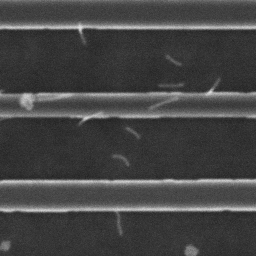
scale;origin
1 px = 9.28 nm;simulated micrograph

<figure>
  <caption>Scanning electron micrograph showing lines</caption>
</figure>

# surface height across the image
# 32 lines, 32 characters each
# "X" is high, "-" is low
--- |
XXXXXXXXXXXXXXXXXXXXXXXXXXXXXXXX
XXXXXXXXXXXXXXXXXXXXXXXXXXXXXXXX
XXXXXXXXXXXXXXXXXXXXXXXXXXXXXXXX
XXXXXXXXXXX-XXXXXXXXXXXXXXXXXXXX
--------------------------------
--------------------------------
--------------------------------
--------------------------------
--------------------------------
--------------------------------
--------------------------------
--------------------------------
XXXXXXXXXXXXXXXXXXXXXXXXXXXXXXXX
XXXXXXXXXXXXXXXXXXXXXXXXXXXXXXXX
XXXXXXXXXXXXXXXXXXXXXXXXXXXXXXXX
--------------------------------
--------------------------------
--------------------------------
--------------------------------
--------------------------------
--------------------------------
--------------------------------
--------------------------------
XXXXXXXXXXXXXXXXXXXXXXXXXXXXXXXX
XXXXXXXXXXXXXXXXXXXXXXXXXXXXXXXX
XXXXXXXXXXXXXXXXXXXXXXXXXXXXXXXX
--------------------------------
--------------------------------
--------------------------------
--------------------------------
--------------------------------
--------------------------------